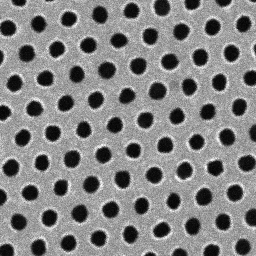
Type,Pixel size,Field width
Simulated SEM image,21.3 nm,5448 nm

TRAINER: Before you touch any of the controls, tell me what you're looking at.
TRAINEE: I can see a regular array of holes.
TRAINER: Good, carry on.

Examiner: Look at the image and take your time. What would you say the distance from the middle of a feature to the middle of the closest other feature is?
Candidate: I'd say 654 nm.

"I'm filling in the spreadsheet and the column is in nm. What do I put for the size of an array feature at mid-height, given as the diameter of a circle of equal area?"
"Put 369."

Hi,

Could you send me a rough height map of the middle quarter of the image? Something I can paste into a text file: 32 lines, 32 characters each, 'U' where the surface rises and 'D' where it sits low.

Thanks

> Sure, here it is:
UUUDUUUUUDDDDUUUDDDDDUUUDDDDDUUU
UUDDDUUUDDDDDUUUUDDDDUUUUDDUUUUU
UDDDDUUUUDDDDUUUUDDDUUUUUUUUUUUU
UDDDDUUUUDDDUUUUUUUUUUUUUUUUUUUU
UUDDUUUUUUUUUUUUUUUUUUUDUUUUUUDD
UUUUUUUUUUUUUUUUUUUUUUDDDUUUUDDD
UUUUUUUUUUUUUUDDDUUUUDDDDDUUUDDD
UUUUUUDDDDUUUUDDDDUUUDDDDDUUUUDD
DDUUUUDDDDUUUUDDDDUUUUDDDUUUUUUU
DDDUUUDDDDUUUUDDDUUUUUUUUUUUUUUU
DDUUUUDDDUUUUUUUUUUUUUUUUUUUUUUU
DDUUUUUUUUUUUUUUUUUUUUUUUUUDDDUU
UUUUUUUUUUUUUUUUUUUDDDUUUUDDDDUU
UUUUUUUUUUUUDDUUUUDDDDUUUUDDDDUU
UUUUDDUUUUUDDDDUUUDDDDUUUUDDDDUU
UUUDDDDUUUUDDDDUUUUDDDUUUUUUUUUU
UUUDDDDUUUUDDDDUUUUUUUUUUUUUUUUU
UUUDDDDUUUUUUUUUUUUUUUUUUUUUUUUU
UUUUDDUUUUUUUUUUUUUUUUUUDDDUUUUD
UUUUUUUUUUUUUUUUUUUUUUUDDDDUUUUD
UUUUUUUUUUUUUUUUDDDUUUUDDDDDUUUD
UUDUUUUUDDDDUUUDDDDUUUUDDDDUUUUU
DDDDUUUUDDDDUUUUDDDUUUUUUUUUUUUU
DDDDUUUUDDDDUUUUDDDUUUUUUUUUUUUU
DDDDUUUUUDDUUUUUUUUUUUUUUUUUUUDU
DDDUUUUUUUUUUUUUUUUUUUUUUUUUUDDD
UUUUUUUUUUUUUUDUUUUUUDDDUUUUDDDD
UUUUUUUUUUUUUDDDDUUUDDDDDUUUDDDD
UUUUUUDDUUUUDDDDDUUUDDDDDUUUUDDU
DUUUUDDDDUUUDDDDDUUUUDDDUUUUUUUU
DUUUUDDDDUUUUDDDUUUUUUUUUUUUUUUU
DUUUUDDDUUUUUUUUUUUUUUUUUUUUUUUU